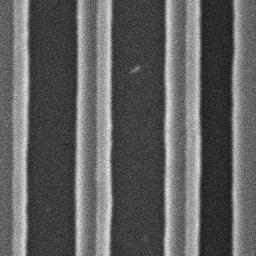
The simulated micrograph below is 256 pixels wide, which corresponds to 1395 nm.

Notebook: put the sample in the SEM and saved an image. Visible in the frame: lines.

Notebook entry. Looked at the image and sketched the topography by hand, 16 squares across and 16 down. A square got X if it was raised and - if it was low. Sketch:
XX---XX---XX---X
XX---XX---XX---X
XX---XX---XX---X
XX---XX---XX---X
XX---XX---XX---X
XX---XX---XX---X
XX---XX----X---X
XX---XX---XX---X
XX---XX---XX---X
XX---XX---XX---X
XX---XX---XX---X
XX---XX---XX---X
XX---XX---XX---X
XX---XX---XX---X
XX---XX---XX---X
X----XX---XX---X